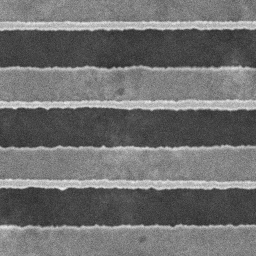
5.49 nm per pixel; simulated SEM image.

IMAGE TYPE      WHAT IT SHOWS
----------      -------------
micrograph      lines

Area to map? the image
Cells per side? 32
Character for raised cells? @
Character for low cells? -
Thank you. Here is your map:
@@@@@@@@@@@@@@@@@@@@@@@@@@@@@@@@
@@@@@@@@@@@@@@@@@@@@@@@@@@@@@@@@
@@@@@@@@@@@@@@@@@@@@@@@@@@@@@@@@
@@@@@@@@@@@@@@@@@@@@@@@@@@@@@@@@
--------------------------------
--------------------------------
--------------------------------
--------------------------------
@@@@---@--@@---@@@@---------@@@-
@@@@@@@@@@@@@@@@@@@@@@@@@@@@@@@@
@@@@@@@@@@@@@@@@@@@@@@@@@@@@@@@@
@@@@@@@@@@@@@@@@@@@@@@@@@@@@@@@@
@@@@@@@@@@@@@@@@@@@@@@@@@@@@@@@@
@@-@-@@--@----@@@@@@@@@@@@@@@@@@
--------------------------------
--------------------------------
--------------------------------
--------------------------------
@@@@@@@@@@@@@@@@@@@@@@@@@@@@@@@@
@@@@@@@@@@@@@@@@@@@@@@@@@@@@@@@@
@@@@@@@@@@@@@@@@@@@@@@@@@@@@@@@@
@@@@@@@@@@@@@@@@@@@@@@@@@@@@@@@@
@@@@@@@@@@@@@@@@@@@@@@@@@@@@@@@@
-------@--------@--@@@-@@@@@@-@@
--------------------------------
--------------------------------
--------------------------------
--------------------------------
@@@@@@@@@@@@@@@@@@@@@@@@@@@@@@@@
@@@@@@@@@@@@@@@@@@@@@@@@@@@@@@@@
@@@@@@@@@@@@@@@@@@@@@@@@@@@@@@@@
@@@@@@@@@@@@@@@@@@@@@@@@@@@@@@@@